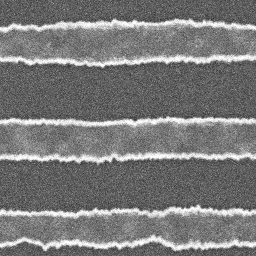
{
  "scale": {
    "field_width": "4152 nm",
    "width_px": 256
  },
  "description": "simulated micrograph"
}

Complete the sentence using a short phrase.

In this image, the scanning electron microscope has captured one or a few lines or trenches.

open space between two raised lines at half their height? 940 nanometers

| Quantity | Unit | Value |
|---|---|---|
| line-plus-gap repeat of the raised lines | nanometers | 1500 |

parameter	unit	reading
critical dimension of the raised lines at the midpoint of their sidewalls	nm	576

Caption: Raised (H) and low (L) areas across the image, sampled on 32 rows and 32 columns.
LLLLLLLLLLLLLLLLLLLLLLLLLLLLLLLL
LLLLLLLLLLLLLLLLLLLLLLLLLLLLLLLL
LLLLLLLLLLLLLLLLLLLLLLLLLLLLLLLL
LHHHHHHHHHHHHHHHHHHHHHHHHHHHHHHH
HHHHHHHHHHHHHHHHHHHHHHHHHHHHHHHH
HHHHHHHHHHHHHHHHHHHHHHHHHHHHHHHH
HHHHHHHHHHHHHHHHHHHHHHHHHHHHHHHH
LLHHHHHHHHHHHHHHHHHLLLLLHHLLLLLL
LLLLLLLLLLLLLLLLLLLLLLLLLLLLLLLL
LLLLLLLLLLLLLLLLLLLLLLLLLLLLLLLL
LLLLLLLLLLLLLLLLLLLLLLLLLLLLLLLL
LLLLLLLLLLLLLLLLLLLLLLLLLLLLLLLL
LLLLLLLLLLLLLLLLLLLLLLLLLLLLLLLL
LLLLLLLLLLLLLLLLLLLLLLLLLLLLLLLL
LLLLLLLLLLLLLLLLLLLLLLLLLLLLLLLL
HHHHHHHHHHHHHHHHHHHHHHHHHHHHHHHH
HHHHHHHHHHHHHHHHHHHHHHHHHHHHHHHH
HHHHHHHHHHHHHHHHHHHHHHHHHHHHHHHH
HHHHHHHHHHHHHHHHHHHHHHHHHHHHHHHH
HHHHHHHHHHHHHHHHHHHHHHHHLHHHHHLH
LLLLLLLLLLLLLLLLLLLLLLLLLLLLLLLL
LLLLLLLLLLLLLLLLLLLLLLLLLLLLLLLL
LLLLLLLLLLLLLLLLLLLLLLLLLLLLLLLL
LLLLLLLLLLLLLLLLLLLLLLLLLLLLLLLL
LLLLLLLLLLLLLLLLLLLLLLLLLLLLLLLL
LLLLLLLLLLLLLLLLLLLLLLLLLLLLLLLL
LLLLLLLLLLLLLLHHHHLLLHHHHHHLLHLL
HHHHHHHHHHHHHHHHHHHHHHHHHHHHHHHH
HHHHHHHHHHHHHHHHHHHHHHHHHHHHHHHH
HHHHHHHHHHHHHHHHHHHHHHHHHHHHHHHH
HLLLLHHHLLLHHHHHHLLLLHHHHHHHHLHH
LLLLLLLLLLLLLLLLLLLLLLLLLLLLLLLL